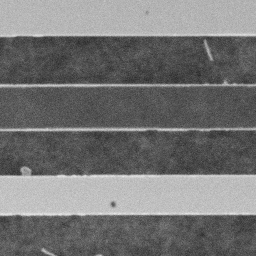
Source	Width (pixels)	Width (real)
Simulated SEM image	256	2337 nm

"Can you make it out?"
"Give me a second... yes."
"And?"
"lines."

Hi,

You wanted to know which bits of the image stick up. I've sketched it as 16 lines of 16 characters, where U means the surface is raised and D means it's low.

UUUUUUUUUUUUUUUU
UUUUUUUUUUUUUUUU
DDDDDDDDDDDDDDDD
DDDDDDDDDDDDDDDD
DDDDDDDDDDDDDDDD
UUUUUUUUUUUUUUUU
UUUUUUUUUUUUUUUU
UUUUUUUUUUUUUUUU
DDDDDDDDDDDDDDDD
DDDDDDDDDDDDDDDD
DDDDDDDDDDDDDDDD
UUUUUUUUUUUUUUUU
UUUUUUUUUUUUUUUU
DDDDDDDDDDDDDDDD
DDDDDDDDDDDDDDDD
DDDDDDDDDDDDDDDD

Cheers